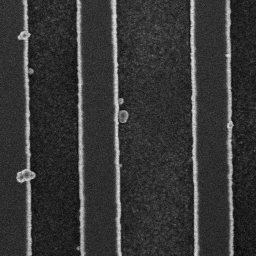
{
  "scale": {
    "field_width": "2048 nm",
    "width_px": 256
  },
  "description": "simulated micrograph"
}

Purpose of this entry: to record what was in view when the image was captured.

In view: lines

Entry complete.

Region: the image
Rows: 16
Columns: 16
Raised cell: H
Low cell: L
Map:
HHLLLHHLLLLLHHLL
HHLLLHHLLLLLHHLL
HHLLLHHLLLLLHHLL
HHLLLHHLLLLLHHLL
HHLLLHHLLLLLHHLL
HHLLLHHLLLLLHHLL
HHLLLHHLLLLLHHLL
HHLLLHHLLLLLHHLL
HHLLLHHLLLLLHHLL
HHLLLHHLLLLLHHLL
HHLLLHHLLLLLHHHL
HHLLLHHLLLLLHHLL
HHLLLHHHLLLLHHHL
HHLLLHHHLLLLHHHL
HHLLLHHHLLLLHHHL
HHLLLHHHLLLLHHHL